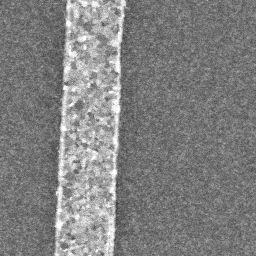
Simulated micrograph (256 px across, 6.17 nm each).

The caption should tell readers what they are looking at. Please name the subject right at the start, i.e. one or a few lines or trenches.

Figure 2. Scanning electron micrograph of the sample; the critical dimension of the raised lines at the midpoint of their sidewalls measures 332 nm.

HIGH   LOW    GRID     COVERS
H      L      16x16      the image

LLLLHHHHLLLLLLLL
LLLLHHHHLLLLLLLL
LLLLHHHLLLLLLLLL
LLLLHHHLLLLLLLLL
LLLLHHHLLLLLLLLL
LLLLHHHLLLLLLLLL
LLLLHHHLLLLLLLLL
LLLLHHHLLLLLLLLL
LLLLHHHLLLLLLLLL
LLLLHHHLLLLLLLLL
LLLLHHHLLLLLLLLL
LLLLHHHLLLLLLLLL
LLLLHHHLLLLLLLLL
LLLLHHHLLLLLLLLL
LLLLHHHLLLLLLLLL
LLLLHHHLLLLLLLLL